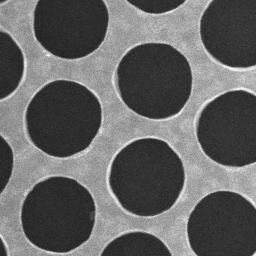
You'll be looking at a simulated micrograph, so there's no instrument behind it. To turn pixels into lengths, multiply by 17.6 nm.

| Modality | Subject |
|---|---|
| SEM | holes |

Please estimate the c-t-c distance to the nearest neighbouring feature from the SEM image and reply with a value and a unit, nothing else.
1700 nanometres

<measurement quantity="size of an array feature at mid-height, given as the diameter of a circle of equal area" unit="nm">1350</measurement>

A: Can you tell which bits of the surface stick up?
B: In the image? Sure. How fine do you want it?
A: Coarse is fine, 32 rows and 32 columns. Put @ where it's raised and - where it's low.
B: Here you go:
@@@@@--------@@@-------@@@------
@@@@----------@@@@---@@@@-------
@@@@----------@@@@@@@@@@@-------
@@@@---------@@@@@@@@@@@@-------
-@@@---------@@@@@@@@@@@@-------
--@@@--------@@@@@---@@@@-------
---@@@------@@@@------@@@@------
---@@@@@@@@@@@@--------@@@@-----
---@@@@@@@@@@@@---------@@@@@@@@
---@@@@@@@@@@@----------@@@@@@@@
--@@@@----@@@@----------@@@@@@@@
--@@@------@@@@---------@@@@---@
@@@@--------@@@---------@@@-----
@@@----------@@@-------@@-------
@@@----------@@@@@----@@@-------
@@@----------@@@@@@@@@@@--------
@@@---------@@@@@@@@@@@@--------
-@@@--------@@@@@---@@@@@-------
-@@@@------@@@@------@@@@-------
--@@@@---@@@@@@-------@@@@------
--@@@@@@@@@@@@---------@@@@----@
--@@@@@@@@@@@@---------@@@@@@@@@
-@@@@----@@@@@---------@@@@@@@@@
-@@@-------@@@---------@@@@@@@@@
@@@--------@@@--------@@@@----@@
@@@---------@@@-------@@@------@
@@@---------@@@@-----@@@--------
@@@---------@@@@@@@@@@@@--------
@@@---------@@@@@@@@@@@---------
@@@--------@@@@----@@@@---------
-@@@------@@@@-------@@@--------
-@@@@@@-@@@@@--------@@@--------